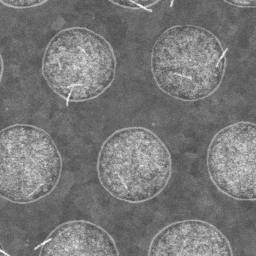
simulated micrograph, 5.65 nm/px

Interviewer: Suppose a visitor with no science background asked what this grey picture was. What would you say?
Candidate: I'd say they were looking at holes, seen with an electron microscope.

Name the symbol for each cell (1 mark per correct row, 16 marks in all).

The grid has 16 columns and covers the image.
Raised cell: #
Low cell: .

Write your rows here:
################
################
###...####....##
###....###....##
###....###....##
###....###...###
################
################
...####...####..
....##....###...
....##.....##...
...###....###...
#.######.#######
################
###....###....##
###....##.....##